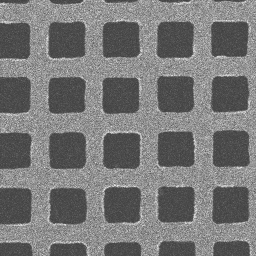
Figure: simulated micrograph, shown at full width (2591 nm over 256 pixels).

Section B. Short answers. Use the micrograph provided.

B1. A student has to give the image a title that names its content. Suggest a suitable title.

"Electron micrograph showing a regular array of holes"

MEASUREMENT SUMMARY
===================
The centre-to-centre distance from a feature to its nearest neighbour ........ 54.1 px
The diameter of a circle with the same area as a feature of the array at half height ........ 406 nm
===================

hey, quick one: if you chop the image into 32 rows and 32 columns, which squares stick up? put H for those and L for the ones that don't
HHHHHHHLLHHHHHHHHHHHHHHHHHHHHHHH
HHHHHHHHHHHHHHHHHHHHHHHHHHHHHHHH
HHHHHHHHHHHHHHHHHHHHHHHHHHHHHHHH
LLLLHHLLLLLHHLLLLHHHLLLLHHLLLLLH
LLLLHHLLLLLHHLLLLHHHLLLLHHLLLLLH
LLLLHHLLLLLHHLLLLHHHLLLLHHLLLLLH
LLLLHHLLLLLHHLLLLHHHLLLLHHLLLLLH
HHHHHHHHHHHHHHHHHHHHHHHHHHHHHHHH
HHHHHHHHHHHHHHHHHHHHHHHHHHHHHHHH
HHHHHHHHHHHHHHHHHHHHLLLHHHHHHHHH
LLLLHHLLLLLHHLLLLHHHLLLLHHHLLLLH
LLLLHHLLLLLHHLLLLHHHLLLLHHLLLLLH
LLLLHHLLLLLHHLLLLHHHLLLLHHLLLLLH
LLLLHHLLLLLHHLLLLHHHLLLLHHHLLLLH
HHHHHHHHHHHHHHHHHHHHHHHHHHHHHHHH
HHHHHHHHHHHHHHHHHHHHHHHHHHHHHHHH
HHHHHHHHHHHHHHHHHHHHLLLLHHHLLLLH
LLLLHHLLLLLHHLLLLLHHLLLLHHHLLLLH
LLLLHHLLLLLHHLLLLHHHLLLLHHHLLLLH
LLLLHHLLLLLHHLLLLLHHLLLLHHHLLLLH
LLLLHHLLLLLHHLLLLHHHLLLLHHHLLLLH
HHHHHHHHHHHHHHHHHHHHHHHHHHHHHHHH
HHHHHHHHHHHHHHHHHHHHHHHHHHHHHHHH
LLHHHHHLHHHHHHLLLHHHLLLLHHHLLLLH
LLLLHHLLLLLHHLLLLLHHLLLLHHHLLLLH
LLLLHHLLLLLHHLLLLLHHLLLLHHHLLLLH
LLLLHHLLLLLHHLLLLHHHLLLLHHHLLLLH
LLLLHHLLLLLHHLLLLHHHLLLLHHHLLLLH
HHHHHHHHHHHHHHHHHHHHHHHHHHHHHHHH
HHHHHHHHHHHHHHHHHHHHHHHHHHHHHHHH
LLLLHHHLLLHHHHLLLHHHLLLLHHHLLLLH
LLLLHHLLLLLHHLLLLLHHLLLLHHHLLLLH